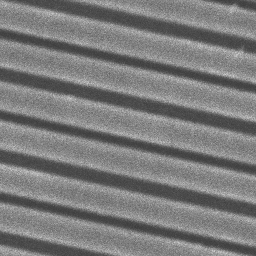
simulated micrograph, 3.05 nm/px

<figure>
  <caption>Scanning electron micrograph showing parallel lines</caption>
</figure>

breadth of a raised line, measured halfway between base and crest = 88.6 nanometers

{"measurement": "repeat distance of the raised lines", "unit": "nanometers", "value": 122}